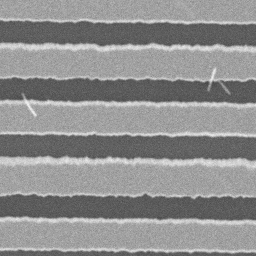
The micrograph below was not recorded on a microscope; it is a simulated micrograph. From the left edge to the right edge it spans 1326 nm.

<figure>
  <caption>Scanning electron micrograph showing lines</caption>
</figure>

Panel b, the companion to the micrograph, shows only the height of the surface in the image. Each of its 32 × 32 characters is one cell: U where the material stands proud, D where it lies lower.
UUUUUUUUUUUUUUUUUUUUUUUUUUUUUUUU
UUUUUUUUUUUUUUUUUUUUUUUUUUUUUUUU
UUUUUUUUUUUUUUUUUUUUUUUUUUUUUUUU
DDDDDDDDDDDDDDDDDDDDDDDDDDDDDDDD
DDDDDDDDDDDDDDDDDDDDDDDDDDDDDDDD
UDDDDDDDDDDDDDDDDDDDDDDDDDDDDDDD
UUUUUUUUUUUUUUUUUUUUUUUUUUUUUUUU
UUUUUUUUUUUUUUUUUUUUUUUUUUUUUUUU
UUUUUUUUUUUUUUUUUUUUUUUUUUUUUUUU
UUUUUUUUUUUUUUUUUUUUUUUUUUUUUUUU
DDDDDDDDDDDDDDDDDDDDDDDDDDDDDDDD
DDDDDDDDDDDDDDDDDDDDDDDDDDDDDDDD
DDDUDDDDDDDDDDDDDDDDDDDDDDDDDDDD
UUUUUUUUUUUUUUUUUUUUUUUUUUUUUUUU
UUUUUUUUUUUUUUUUUUUUUUUUUUUUUUUU
UUUUUUUUUUUUUUUUUUUUUUUUUUUUUUUU
UUUUUUUUUUUUUUUUUUUUUUUUUUUUUUUU
DDDDDDDDDDDDDDDDDDDDDDDDDDDDDDDD
DDDDDDDDDDDDDDDDDDDDDDDDDDDDDDDD
DDDDDDDDDDDDDDDDDDDDDDDDDDDDDDDD
UUUUUUUUUUUUUUUUUUUUUUUUUUUUUUUU
UUUUUUUUUUUUUUUUUUUUUUUUUUUUUUUU
UUUUUUUUUUUUUUUUUUUUUUUUUUUUUUUU
UUUUUUUUUUUUUUUUUUUUUUUUUUUUUUUU
DDDDDDDDDDDDDDDDUDDDDUUUUUUUDUUU
DDDDDDDDDDDDDDDDDDDDDDDDDDDDDDDD
DDDDDDDDDDDDDDDDDDDDDDDDDDDDDDDD
UUUUUUUUUUUUUUUUUUUUUUUUUUUDDDUD
UUUUUUUUUUUUUUUUUUUUUUUUUUUUUUUU
UUUUUUUUUUUUUUUUUUUUUUUUUUUUUUUU
UUUUUUUUUUUUUUUUUUUUUUUUUUUUUUUU
DDDDDDDDDDDDDDDDUDDDDUDUDDUUUUUU